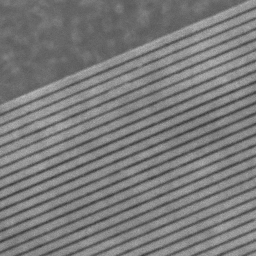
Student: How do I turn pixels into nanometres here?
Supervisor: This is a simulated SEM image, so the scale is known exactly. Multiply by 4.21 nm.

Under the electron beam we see parallel lines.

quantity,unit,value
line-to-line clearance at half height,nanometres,11.2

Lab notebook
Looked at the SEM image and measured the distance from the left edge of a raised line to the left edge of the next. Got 0.0411 microns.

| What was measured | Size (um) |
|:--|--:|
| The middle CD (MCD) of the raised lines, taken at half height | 0.0296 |